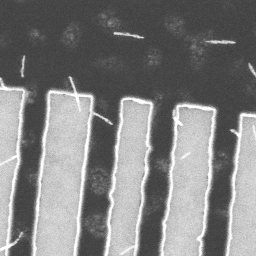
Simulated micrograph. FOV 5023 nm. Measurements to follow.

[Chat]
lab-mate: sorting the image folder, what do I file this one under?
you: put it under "one or a few lines or trenches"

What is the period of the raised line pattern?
1270 nm